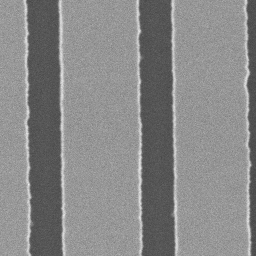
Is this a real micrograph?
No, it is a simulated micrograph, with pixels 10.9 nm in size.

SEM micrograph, lines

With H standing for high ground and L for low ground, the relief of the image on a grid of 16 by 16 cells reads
HHLLHHHHHLLHHHHL
HHLLHHHHHLLHHHHL
HHLLHHHHHLLHHHHL
HHLLHHHHHLLHHHHH
HHLLHHHHHLLHHHHH
HHLLHHHHHLLHHHHL
HHLLHHHHHLLHHHHH
HHLLHHHHHLLHHHHH
HHLLHHHHHLLHHHHH
HHLLHHHHHLLHHHHH
HHLLHHHHHLLHHHHH
HHLLHHHHHLLHHHHH
HHLLHHHHHLLHHHHH
HHLLHHHHHLLHHHHH
HHLLHHHHHLLHHHHH
HHLLHHHHHLLHHHHH